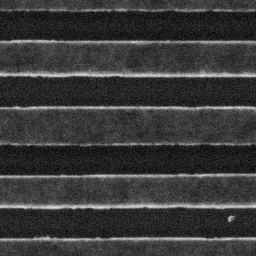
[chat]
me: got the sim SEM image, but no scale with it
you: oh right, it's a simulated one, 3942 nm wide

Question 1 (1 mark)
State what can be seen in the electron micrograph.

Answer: lines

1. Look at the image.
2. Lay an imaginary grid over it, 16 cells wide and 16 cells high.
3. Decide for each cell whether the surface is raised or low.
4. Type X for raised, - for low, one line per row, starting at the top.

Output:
XXXXXXXXXXXXXXXX
----------------
----------------
XXXXXXXXXXXXXXXX
XXXXXXXXXXXXXXXX
----------------
----------------
XXXXXXXXXXXXXXXX
XXXXXXXXXXXXXXXX
----------------
----------------
XXXXXXXXXXXXXXXX
XXXXXXXXXXXXXXXX
----------------
----------------
XXXXXXXXXXXXXXXX